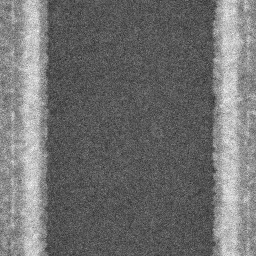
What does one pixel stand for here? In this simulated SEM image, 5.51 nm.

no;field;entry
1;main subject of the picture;one or a few lines or trenches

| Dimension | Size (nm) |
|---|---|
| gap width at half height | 1100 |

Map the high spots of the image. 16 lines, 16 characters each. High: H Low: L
HHLLLLLLLLLLLLHH
HHLLLLLLLLLLLLHH
HHLLLLLLLLLLLLHH
HHLLLLLLLLLLLLHH
HHLLLLLLLLLLLLHH
HHLLLLLLLLLLLLHH
HHLLLLLLLLLLLLHH
HHLLLLLLLLLLLLHH
HHLLLLLLLLLLLLHH
HHLLLLLLLLLLLLHH
HHLLLLLLLLLLLLHH
HHLLLLLLLLLLLLHH
HHLLLLLLLLLLLLHH
HHLLLLLLLLLLLLHH
HHLLLLLLLLLLLLHH
HHLLLLLLLLLLLLHH